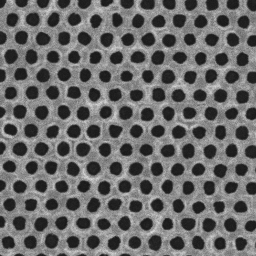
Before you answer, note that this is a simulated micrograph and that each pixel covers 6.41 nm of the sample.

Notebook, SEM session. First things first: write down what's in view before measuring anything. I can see a regular array of holes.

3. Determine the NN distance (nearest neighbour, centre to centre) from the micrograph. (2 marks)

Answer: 130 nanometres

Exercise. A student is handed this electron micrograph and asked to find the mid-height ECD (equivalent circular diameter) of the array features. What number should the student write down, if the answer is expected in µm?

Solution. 0.0846